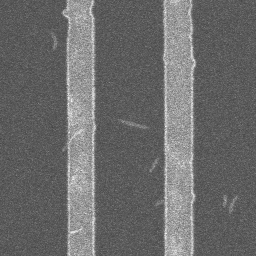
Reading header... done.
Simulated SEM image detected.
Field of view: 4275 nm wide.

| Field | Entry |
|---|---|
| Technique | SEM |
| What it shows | one or a few lines or trenches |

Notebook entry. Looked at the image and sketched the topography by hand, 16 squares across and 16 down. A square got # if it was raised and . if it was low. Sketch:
####..####..####
####..####..####
####..####..####
####..####..####
####..####..####
####..####..####
####..####..####
####..####..####
####..####..####
####..####..####
####..####..####
####..####..####
####..####..####
####..####..####
####..####..####
####..####..####